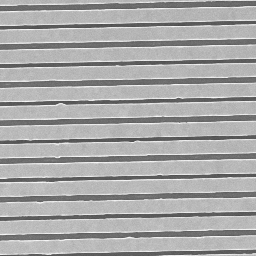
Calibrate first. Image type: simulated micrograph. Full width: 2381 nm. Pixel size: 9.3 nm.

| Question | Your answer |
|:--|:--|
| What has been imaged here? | parallel lines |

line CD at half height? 129 nm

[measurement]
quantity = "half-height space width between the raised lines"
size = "47.7 nanometers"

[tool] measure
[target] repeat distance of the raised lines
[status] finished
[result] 0.178 micrometres